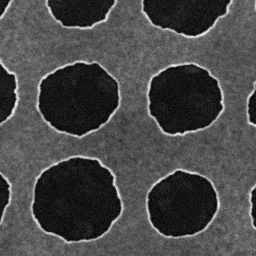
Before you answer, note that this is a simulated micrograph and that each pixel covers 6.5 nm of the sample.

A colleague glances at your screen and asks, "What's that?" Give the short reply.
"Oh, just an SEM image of holes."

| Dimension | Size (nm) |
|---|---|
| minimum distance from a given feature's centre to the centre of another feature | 673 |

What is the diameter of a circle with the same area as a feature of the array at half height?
0.483 microns